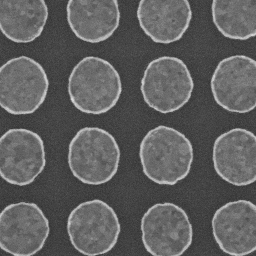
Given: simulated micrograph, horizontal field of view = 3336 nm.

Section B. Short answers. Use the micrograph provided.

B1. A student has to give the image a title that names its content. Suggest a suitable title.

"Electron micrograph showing raised bodies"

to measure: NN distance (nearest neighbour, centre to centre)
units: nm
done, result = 922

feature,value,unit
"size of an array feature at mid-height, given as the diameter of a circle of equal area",682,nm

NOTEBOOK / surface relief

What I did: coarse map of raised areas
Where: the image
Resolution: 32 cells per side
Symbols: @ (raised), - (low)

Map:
@@@@@@---@@@@@@---@@@@@----@@@@@
@@@@@@---@@@@@@--@@@@@@@---@@@@@
@@@@@@---@@@@@@--@@@@@@@---@@@@@
@@@@@----@@@@@----@@@@@----@@@@@
-@@@@-----@@@------@@@-------@@-
--------------------------------
--------------------------------
--@@------@@@-------@@------@@@-
@@@@@----@@@@@----@@@@@----@@@@@
@@@@@@---@@@@@@---@@@@@@---@@@@@
@@@@@@---@@@@@@---@@@@@@---@@@@@
@@@@@@---@@@@@@---@@@@@@---@@@@@
@@@@@----@@@@@@---@@@@@----@@@@@
-@@@------@@@@-----@@@------@@@@
--------------------------------
--------------------------------
-@@@------@@@------@@@-------@@-
@@@@@----@@@@@----@@@@@----@@@@@
@@@@@----@@@@@@---@@@@@@---@@@@@
@@@@@----@@@@@@---@@@@@@---@@@@@
@@@@@----@@@@@@---@@@@@@---@@@@@
@@@@@----@@@@@----@@@@@----@@@@@
-@@@------@@@------@@@------@@@@
--------------------------------
--------------------------------
--@@------@@@----------------@@-
@@@@@----@@@@@-----@@@@----@@@@@
@@@@@@---@@@@@@---@@@@@----@@@@@
@@@@@@---@@@@@@---@@@@@@---@@@@@
@@@@@@---@@@@@@---@@@@@@---@@@@@
@@@@@----@@@@@----@@@@@@----@@@@
-@@@------@@@------@@@@-----@@@-